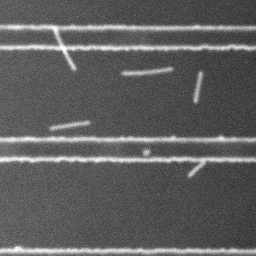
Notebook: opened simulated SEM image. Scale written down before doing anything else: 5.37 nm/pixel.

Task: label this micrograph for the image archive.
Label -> lines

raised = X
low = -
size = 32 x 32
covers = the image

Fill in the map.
--------------------------------
--------------------------------
--------------------------------
XXXXXXXXXXXXXXXXXXXXXXXXXXXXXXXX
XXXXXXXXXXXXXXXXXXXXXXXXXXXXXXXX
XXXXXXXXXXXXXXXXXXXXXXXXXXXXXXXX
--------------------------------
--------------------------------
--------------------------------
--------------------------------
--------------------------------
--------------------------------
--------------------------------
--------------------------------
--------------------------------
--------------------------------
--------------------------------
XXXXXXXXXXXXXXXXXXXXXXXXXXXXXXXX
XXXXXXXXXXXXXXXXXXXXXXXXXXXXXXXX
XXXXXXXXXXXXXXXXXXXXXXXXXXXXXXXX
--------------------------------
--------------------------------
--------------------------------
--------------------------------
--------------------------------
--------------------------------
--------------------------------
--------------------------------
--------------------------------
--------------------------------
--------------------------------
XXXXXXXXXXXXXXXXXXXXXXXXXXXXXXXX